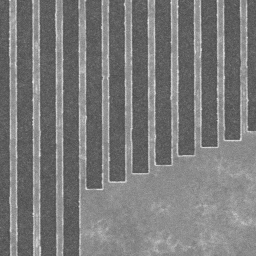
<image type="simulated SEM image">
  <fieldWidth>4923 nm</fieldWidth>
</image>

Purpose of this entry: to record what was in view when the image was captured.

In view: parallel lines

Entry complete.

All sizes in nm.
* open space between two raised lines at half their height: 315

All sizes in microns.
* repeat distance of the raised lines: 0.444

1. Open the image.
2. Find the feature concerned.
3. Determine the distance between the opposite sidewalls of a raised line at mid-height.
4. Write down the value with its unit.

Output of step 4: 130 nm